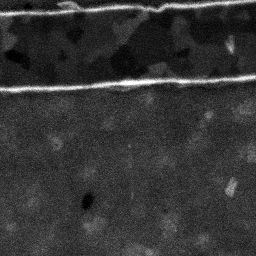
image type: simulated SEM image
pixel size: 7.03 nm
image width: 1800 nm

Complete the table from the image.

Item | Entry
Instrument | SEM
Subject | one or a few lines or trenches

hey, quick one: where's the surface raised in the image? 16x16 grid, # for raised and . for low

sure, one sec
.......##.######
################
################
################
################
####............
................
................
................
................
................
................
................
................
................
................